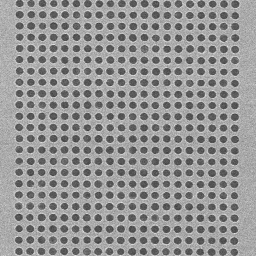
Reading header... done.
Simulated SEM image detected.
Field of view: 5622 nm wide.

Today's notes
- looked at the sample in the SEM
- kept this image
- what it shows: a regular array of holes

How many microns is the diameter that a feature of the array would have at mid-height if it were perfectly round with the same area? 0.175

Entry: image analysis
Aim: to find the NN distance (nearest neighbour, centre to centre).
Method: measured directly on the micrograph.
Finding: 242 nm